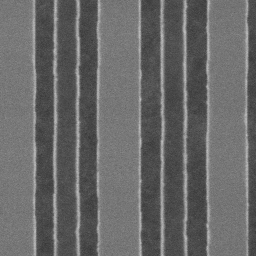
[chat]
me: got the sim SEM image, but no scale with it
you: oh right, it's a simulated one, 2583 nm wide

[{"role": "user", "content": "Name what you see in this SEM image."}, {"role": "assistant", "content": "lines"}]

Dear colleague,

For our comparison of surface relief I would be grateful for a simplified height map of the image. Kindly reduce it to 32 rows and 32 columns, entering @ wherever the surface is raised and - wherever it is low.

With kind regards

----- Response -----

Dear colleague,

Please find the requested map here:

@@@@---@@@--@@@@@---@@@---@@@@@-
@@@@---@@@--@@@@@---@@@---@@@@@-
@@@@---@@@--@@@@@---@@@---@@@@@-
@@@@---@@@--@@@@@---@@@---@@@@@-
@@@@---@@@--@@@@@---@@@---@@@@@-
@@@@---@@@--@@@@@---@@@---@@@@@-
@@@@---@@@--@@@@@---@@@---@@@@@-
@@@@---@@@--@@@@@---@@@---@@@@@-
@@@@---@@@--@@@@@---@@@---@@@@@-
@@@@---@@@--@@@@@@--@@@---@@@@@-
@@@@---@@@--@@@@@---@@@---@@@@@-
@@@@---@@@--@@@@@---@@@---@@@@@-
@@@@---@@@--@@@@@---@@@---@@@@@-
@@@@---@@@--@@@@@---@@@---@@@@@-
@@@@---@@@--@@@@@---@@@---@@@@@-
@@@@---@@@--@@@@@---@@@---@@@@@-
@@@@---@@@--@@@@@---@@@---@@@@@-
@@@@---@@@--@@@@@---@@@---@@@@@-
@@@@---@@@--@@@@@---@@@---@@@@@-
@@@@---@@@--@@@@@---@@@---@@@@@-
@@@@---@@@--@@@@@---@@@---@@@@@-
@@@@---@@@--@@@@@---@@@---@@@@@-
@@@@---@@@--@@@@@---@@@---@@@@@-
@@@@---@@@--@@@@@---@@@---@@@@@-
@@@@---@@@--@@@@@---@@@---@@@@@-
@@@@---@@@--@@@@@---@@@---@@@@@-
@@@@---@@@--@@@@@---@@@---@@@@@-
@@@@---@@@--@@@@@---@@@---@@@@@-
@@@@---@@@--@@@@@---@@@---@@@@@-
@@@@---@@@--@@@@@---@@@---@@@@@-
@@@@---@@@--@@@@@@--@@@---@@@@@-
@@@@---@@@--@@@@@@--@@@---@@@@@-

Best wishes